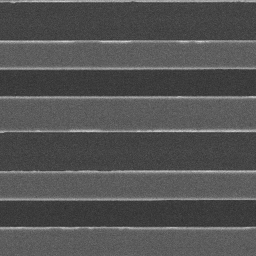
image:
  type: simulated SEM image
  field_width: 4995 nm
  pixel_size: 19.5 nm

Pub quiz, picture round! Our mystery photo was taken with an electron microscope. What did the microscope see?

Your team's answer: lines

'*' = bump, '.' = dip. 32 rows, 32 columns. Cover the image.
................................
................................
................................
................................
................................
********************************
********************************
********************************
********************************
................................
................................
................................
********************************
********************************
********************************
********************************
................................
................................
................................
................................
................................
********************************
********************************
********************************
********************************
................................
................................
................................
*****************...***....*..**
********************************
********************************
********************************